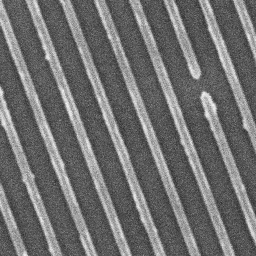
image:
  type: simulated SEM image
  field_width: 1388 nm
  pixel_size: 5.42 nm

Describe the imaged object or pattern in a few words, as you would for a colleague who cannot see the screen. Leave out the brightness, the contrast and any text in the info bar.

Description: parallel lines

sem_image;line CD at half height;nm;46.3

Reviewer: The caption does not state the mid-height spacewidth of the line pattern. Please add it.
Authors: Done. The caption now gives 129 nm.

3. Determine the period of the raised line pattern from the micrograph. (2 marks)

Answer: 175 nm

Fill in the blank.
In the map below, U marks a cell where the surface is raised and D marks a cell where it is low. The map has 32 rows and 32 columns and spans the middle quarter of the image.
DDDDDUUUDDDDDDUUDDDDDDDUUDDDDDDU
DDDDDDUUDDDDDDUUUDDDDDDUUDDDDDDU
DDDDDDUUDDDDDDDUUDDDDDDUUUDDDDDD
DDDDDDUUUDDDDDDUUDDDDDDDUUDDDDDD
DDDDDDDUUDDDDDDUUUDDDDDDUUDDDDDD
UDDDDDDUUDDDDDDDUUDDDDDDDUUDDDDD
UDDDDDDDUUDDDDDDUUDDDDDDDUUDDDDD
UUDDDDDDUUDDDDDDDUUDDDDDDUUUDDDD
UUDDDDDDUUUDDDDDDUUDDDDDDDUUDDDD
UUUDDDDDDUUDDDDDDUUUDDDDDDUUDDDD
DUUDDDDDDUUDDDDDDDUUDDDDDDUUUDDD
DUUDDDDDDUUUDDDDDDUUDDDDDDDUUDDD
DUUUDDDDDDUUDDDDDDUUUDDDDDDUUDDD
DDUUDDDDDDUUDDDDDDDUUDDDDDDDUUDD
DDUUDDDDDDUUUDDDDDDUUDDDDDDDUUDD
DDDUUDDDDDDUUDDDDDDDUUDDDDDDUUUD
DDDUUDDDDDDUUDDDDDDDUUDDDDDDUUUD
DDDUUDDDDDDDUUDDDDDDUUUDDDDDDUUD
DDDDUUDDDDDDUUDDDDDDDUUDDDDDDUUU
DDDDUUDDDDDDUUUDDDDDDUUDDDDDDUUU
DDDDUUDDDDDDDUUDDDDDDUUUDDDDDDUU
DDDDDUUDDDDDDUUUDDDDDDUUDDDDDDUU
DDDDDUUDDDDDDDUUDDDDDDUUDDDDDDDU
DDDDDDUUDDDDDDUUDDDDDDDUUDDDDDDU
DDDDDDUUDDDDDDUUUDDDDDDUUDDDDDDU
DDDDDDUUDDDDDDDUUDDDDDDUUUDDDDDD
DDDDDDDUUDDDDDDUUDDDDDDDUUDDDDDD
DDDDDDDUUDDDDDDUUUDDDDDDUUDDDDDD
UDDDDDDUUUDDDDDDUUDDDDDDUUUDDDDD
UDDDDDDDUUDDDDDDUUDDDDDDDUUDDDDD
UUDDDDDDUUDDDDDDDUUDDDDDDUUDDDDD
UUDDDDDDUUUDDDDDDUUDDDDDDDUUDDDD